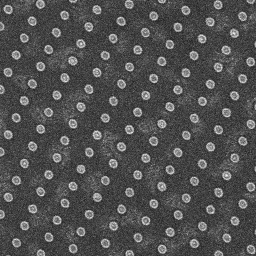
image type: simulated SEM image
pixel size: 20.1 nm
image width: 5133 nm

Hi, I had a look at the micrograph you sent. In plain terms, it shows a regular array of raised bodies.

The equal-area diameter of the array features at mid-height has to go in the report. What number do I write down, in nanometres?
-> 166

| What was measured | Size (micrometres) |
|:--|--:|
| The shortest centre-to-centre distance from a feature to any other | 0.376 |